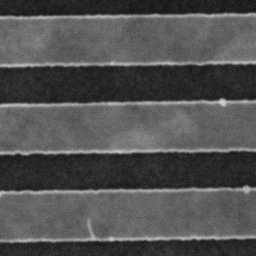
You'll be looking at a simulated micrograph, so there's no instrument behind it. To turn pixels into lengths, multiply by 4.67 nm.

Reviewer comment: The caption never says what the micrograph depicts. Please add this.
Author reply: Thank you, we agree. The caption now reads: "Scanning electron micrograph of lines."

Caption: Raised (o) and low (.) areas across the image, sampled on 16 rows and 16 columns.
................
oooooooooooooooo
oooooooooooooooo
oooooooooooooooo
................
................
....oooooooooooo
oooooooooooooooo
oooooooooooooooo
ooooooooo.......
................
................
oooooooooooooooo
oooooooooooooooo
oooooooooooooooo
................